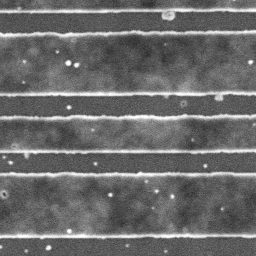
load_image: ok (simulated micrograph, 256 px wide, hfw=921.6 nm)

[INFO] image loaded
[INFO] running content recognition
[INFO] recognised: lines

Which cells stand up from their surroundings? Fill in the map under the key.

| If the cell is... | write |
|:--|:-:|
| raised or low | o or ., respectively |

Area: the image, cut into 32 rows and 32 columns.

oooooooooooooooooooooooooooooooo
....................oo..........
................................
................................
oooooooooooooooooooooooooooooooo
oooooooooooooooooooooooooooooooo
oooooooooooooooooooooooooooooooo
oooooooooooooooooooooooooooooooo
oooooooooooooooooooooooooooooooo
oooooooooooooooooooooooooooooooo
oooooooooooooooooooooooooooooooo
oooooooooooooooooooooooooooooooo
................................
................................
.........oo......oo...ooo..ooooo
oooooooooooooooooooooooooooooooo
oooooooooooooooooooooooooooooooo
oooooooooooooooooooooooooooooooo
oooooooooooooooooooooooooooooooo
................................
................................
................................
oooooooooooooooooooooooooooooooo
oooooooooooooooooooooooooooooooo
oooooooooooooooooooooooooooooooo
oooooooooooooooooooooooooooooooo
oooooooooooooooooooooooooooooooo
oooooooooooooooooooooooooooooooo
oooooooooooooooooooooooooooooooo
oooooooooooooooooo.ooo.oo.....oo
................................
................................